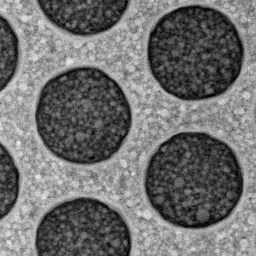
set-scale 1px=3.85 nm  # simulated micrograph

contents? holes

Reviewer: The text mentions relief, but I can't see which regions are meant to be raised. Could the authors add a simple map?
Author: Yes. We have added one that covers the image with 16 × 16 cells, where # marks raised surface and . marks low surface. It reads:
##......###..###
.##....###.....#
.########......#
.########......#
.###...##......#
###.....##....##
##......########
##......########
##......###..###
.##....###.....#
.########......#
.########......#
.###..###......#
###.....##....##
##......########
##......########